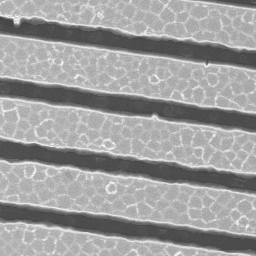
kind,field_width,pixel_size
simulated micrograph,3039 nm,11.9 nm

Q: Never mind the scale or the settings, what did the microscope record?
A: one or a few lines or trenches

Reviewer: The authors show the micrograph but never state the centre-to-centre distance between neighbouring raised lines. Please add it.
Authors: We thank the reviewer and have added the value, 61.4 pixels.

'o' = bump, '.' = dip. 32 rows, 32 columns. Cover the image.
ooooooooooooooooooooooooooooo...
oooooooooooooooooooooooooooooooo
.oo..ooooooooooooooooooooooooooo
............oooooooooooooooooooo
oo...............ooooooooooooooo
oooooooooo................oooooo
ooooooooooooooooo...............
oooooooooooooooooooooooo........
ooooooooooooooooooooooooooooooo.
oooooooooooooooooooooooooooooooo
....oooooooooooooooooooooooooooo
...........ooooooooooooooooooooo
oooo................oooooooooooo
ooooooooooo..............ooooooo
oooooooooooooooooo.o............
oooooooooooooooooooooooooo......
oooooooooooooooooooooooooooooooo
oooooooooooooooooooooooooooooooo
......oooooooooooooooooooooooooo
..............oooooooooooooooooo
oooooo................oooooooooo
ooooooooooooo................ooo
oooooooooooooooooooo............
oooooooooooooooooooooooooooo....
oooooooooooooooooooooooooooooooo
.ooooooooooooooooooooooooooooooo
........oooooooooooooooooooooooo
................oooooooooooooooo
ooooooooo..............ooooooooo
ooooooooooooooo................o
oooooooooooooooooooooo..........
oooooooooooooooooooooooooooo....